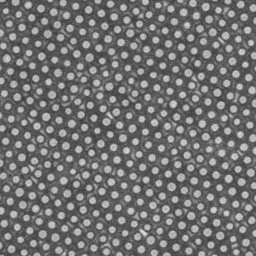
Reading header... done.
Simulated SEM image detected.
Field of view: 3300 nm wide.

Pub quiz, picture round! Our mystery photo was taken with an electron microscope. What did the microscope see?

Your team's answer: a regular array of raised bodies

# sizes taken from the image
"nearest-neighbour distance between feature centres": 166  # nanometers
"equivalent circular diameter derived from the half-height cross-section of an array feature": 79.7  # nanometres